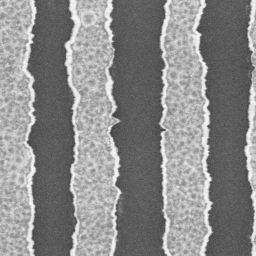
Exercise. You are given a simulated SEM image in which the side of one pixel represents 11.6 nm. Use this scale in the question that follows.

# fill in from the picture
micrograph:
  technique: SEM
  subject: one or a few lines or trenches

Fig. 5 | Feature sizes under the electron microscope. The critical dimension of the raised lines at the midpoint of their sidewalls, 449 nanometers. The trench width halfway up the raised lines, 0.543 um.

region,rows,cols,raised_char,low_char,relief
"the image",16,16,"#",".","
##...##...###...
##...##...##....
##...##...##....
##..###...##....
##..###...###...
##...##...###...
##...##...###...
##...##...###...
##...##...###...
##...##...###...
##...##...###...
##..###...###...
##...##...###...
##...##...###...
##...##...###...
##...##...###...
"